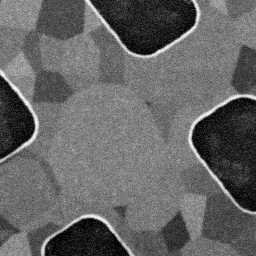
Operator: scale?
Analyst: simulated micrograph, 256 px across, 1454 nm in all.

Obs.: holes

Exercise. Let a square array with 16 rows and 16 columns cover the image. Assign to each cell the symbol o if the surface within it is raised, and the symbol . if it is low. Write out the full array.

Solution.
oooooo......oooo
ooooooo.....oooo
ooooooo....ooooo
oooooooooooooooo
oooooooooooooooo
.ooooooooooooooo
..oooooooooooo..
..oooooooooo....
..oooooooooo....
.ooooooooooo....
ooooooooooooo...
oooooooooooooo..
ooooooooooooooo.
oooooooooooooooo
oooo...ooooooooo
ooo.....oooooooo